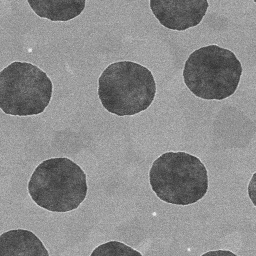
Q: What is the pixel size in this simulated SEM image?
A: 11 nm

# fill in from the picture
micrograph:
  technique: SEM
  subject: holes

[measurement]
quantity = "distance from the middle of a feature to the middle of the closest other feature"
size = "1050 nm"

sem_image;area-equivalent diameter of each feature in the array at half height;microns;0.625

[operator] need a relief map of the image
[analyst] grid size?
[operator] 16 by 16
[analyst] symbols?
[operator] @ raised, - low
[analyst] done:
@@---@@@@----@@@
@@@@@@@@@@--@@@@
@@@@@@@@@@@@@@@@
@@@@@@@@@@@@---@
---@@@---@@----@
---@@@----@@---@
---@@@---@@@@@@@
@@@@@@@@@@@@@@@@
@@@@@@@@@@@@@@@@
@@@@@@@@@@@@@@@@
@@---@@@@----@@@
@@---@@@@----@@@
@@---@@@@@--@@@@
@@@@@@@@@@@@@@@@
--@@@@@@@@@@@@@@
---@@@--@@@@@@@@